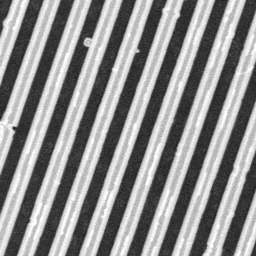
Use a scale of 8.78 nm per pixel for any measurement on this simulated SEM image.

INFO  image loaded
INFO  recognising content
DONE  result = parallel lines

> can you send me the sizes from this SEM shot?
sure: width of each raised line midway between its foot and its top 94.4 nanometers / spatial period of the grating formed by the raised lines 256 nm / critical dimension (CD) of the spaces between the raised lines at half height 157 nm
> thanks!